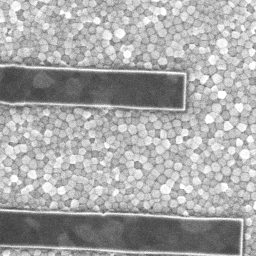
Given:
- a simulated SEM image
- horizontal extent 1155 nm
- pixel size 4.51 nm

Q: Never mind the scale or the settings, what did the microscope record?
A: one or a few lines or trenches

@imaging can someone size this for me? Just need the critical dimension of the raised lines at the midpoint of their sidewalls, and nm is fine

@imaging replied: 164